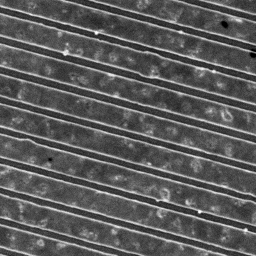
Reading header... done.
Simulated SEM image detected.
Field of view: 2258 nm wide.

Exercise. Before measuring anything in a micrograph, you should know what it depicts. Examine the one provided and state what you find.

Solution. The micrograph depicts parallel lines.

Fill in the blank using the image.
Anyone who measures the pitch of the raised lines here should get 257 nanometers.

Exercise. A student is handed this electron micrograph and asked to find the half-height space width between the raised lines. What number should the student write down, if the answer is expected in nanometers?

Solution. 56.4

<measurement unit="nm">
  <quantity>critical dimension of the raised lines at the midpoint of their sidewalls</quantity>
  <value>201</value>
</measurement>